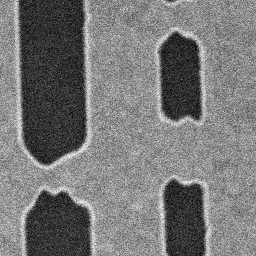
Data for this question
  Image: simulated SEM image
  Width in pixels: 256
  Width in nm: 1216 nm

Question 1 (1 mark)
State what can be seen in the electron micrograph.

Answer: one or a few lines or trenches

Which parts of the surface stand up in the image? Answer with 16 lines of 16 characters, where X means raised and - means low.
X----XXXXXXXXXXX
X----XXXXXXXXXXX
X----XXXXX--XXXX
X----XXXXX---XXX
X-----XXXX---XXX
X-----XXXX---XXX
X-----XXXX---XXX
X-----XXXX--XXXX
X-----XXXXXXXXXX
XX---XXXXXXXXXXX
XXXXXXXXXXXXXXXX
XXXXXXXXXX---XXX
XX---XXXXX---XXX
X-----XXXX---XXX
X-----XXXX---XXX
X-----XXXX---XXX